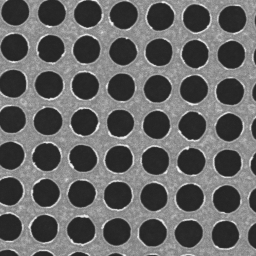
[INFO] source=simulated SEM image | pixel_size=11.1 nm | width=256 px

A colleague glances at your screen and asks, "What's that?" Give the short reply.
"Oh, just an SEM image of a regular array of holes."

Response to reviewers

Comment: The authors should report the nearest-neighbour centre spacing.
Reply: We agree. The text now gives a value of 0.397 µm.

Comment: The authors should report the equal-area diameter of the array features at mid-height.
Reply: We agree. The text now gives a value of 305 nanometers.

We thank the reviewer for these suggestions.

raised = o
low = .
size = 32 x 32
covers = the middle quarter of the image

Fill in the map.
ooooooooooooooooooooooo.ooooooo.
oooooooooooooooooooooooooooooooo
oooo...oooooo..ooooooooooooooooo
oo......oooo.....oooo....oooooo.
oo.......oo.......ooo.....oooo..
oo.......oo.......oo.......oo...
oo.......oo.......oo.......oo...
ooo.....ooo......ooo.......oo...
oooo...ooooo.....oooo.....oooo..
oooooooooooooooooooooo...oooooo.
oooooooooooooooooooooooooooooooo
oooo...oooooo..ooooooooooooooooo
oo......ooo......oooo....ooooo..
oo......ooo......ooo......ooo...
oo.......oo.......oo.......oo...
oo......ooo......ooo.......o....
oo......ooo......ooo......ooo...
oooo...ooooo....ooooo.....ooo...
oooooooooooooooooooooo..ooooooo.
oooooooooooooooooooooooooooooooo
ooo...ooooooo..ooooooooooooooooo
oo.....oooo.....ooooo....ooooo..
o.......ooo......ooo......ooo...
o.......oo.......oo.......oo....
oo......oo.......oo.......oo....
oo......ooo......ooo......ooo...
ooo....oooo.....oooo.....oooo...
oooooooooooooooooooooo..oooooo..
oooooooooooooooooooooooooooooooo
ooo...oooooo..oooooooooooooooooo
oo.....oooo.....oooo.....ooooo..
o.......oo.......ooo.....oooo...